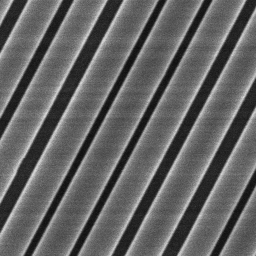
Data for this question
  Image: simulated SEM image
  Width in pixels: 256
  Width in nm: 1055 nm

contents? parallel lines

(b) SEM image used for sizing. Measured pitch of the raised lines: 170 nanometres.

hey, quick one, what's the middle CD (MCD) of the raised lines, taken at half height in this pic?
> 123 nanometers